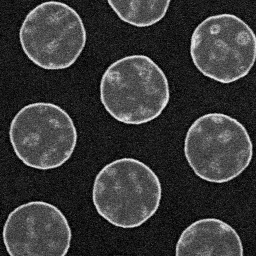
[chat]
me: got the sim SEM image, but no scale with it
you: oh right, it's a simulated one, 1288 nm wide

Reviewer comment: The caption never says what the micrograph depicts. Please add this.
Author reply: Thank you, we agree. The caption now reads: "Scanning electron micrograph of raised bodies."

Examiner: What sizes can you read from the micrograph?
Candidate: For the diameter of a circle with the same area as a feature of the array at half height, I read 336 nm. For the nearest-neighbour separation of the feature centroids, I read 101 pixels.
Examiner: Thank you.